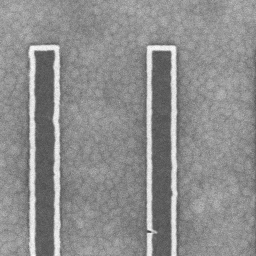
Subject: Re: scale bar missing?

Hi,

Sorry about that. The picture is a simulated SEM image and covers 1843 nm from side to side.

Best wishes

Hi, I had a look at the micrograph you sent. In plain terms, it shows one or a few lines or trenches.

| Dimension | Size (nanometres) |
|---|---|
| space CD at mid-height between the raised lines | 663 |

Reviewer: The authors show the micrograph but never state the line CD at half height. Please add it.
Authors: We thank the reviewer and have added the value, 0.176 µm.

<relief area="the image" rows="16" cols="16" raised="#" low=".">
................
................
................
..##.....##.....
..##.....##.....
..##.....##.....
..##.....##.....
..##.....##.....
..##.....##.....
..##.....##.....
..##.....##.....
..##.....##.....
..##.....##.....
..##.....##.....
..##.....##.....
..##.....##.....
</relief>